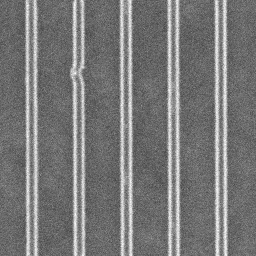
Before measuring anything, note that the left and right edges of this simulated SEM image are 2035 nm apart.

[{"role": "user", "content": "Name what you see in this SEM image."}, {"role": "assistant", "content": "parallel lines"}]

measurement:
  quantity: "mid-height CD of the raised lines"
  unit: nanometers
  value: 67.6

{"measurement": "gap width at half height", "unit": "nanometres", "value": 307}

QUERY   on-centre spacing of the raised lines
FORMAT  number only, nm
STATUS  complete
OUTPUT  377